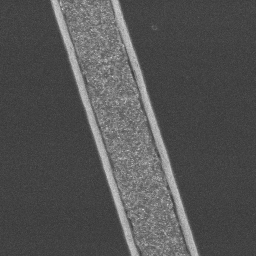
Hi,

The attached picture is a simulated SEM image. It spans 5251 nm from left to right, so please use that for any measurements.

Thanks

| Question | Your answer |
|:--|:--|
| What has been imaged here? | one or a few lines or trenches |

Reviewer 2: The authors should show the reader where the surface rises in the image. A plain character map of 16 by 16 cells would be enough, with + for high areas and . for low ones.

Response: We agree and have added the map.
++++...+++++++++
++++....++++++++
++++....++++++++
+++++...++++++++
+++++....+++++++
+++++....+++++++
+++++....+++++++
++++++....++++++
++++++....++++++
++++++....++++++
+++++++...++++++
+++++++....+++++
+++++++....+++++
++++++++...+++++
++++++++....++++
++++++++....++++